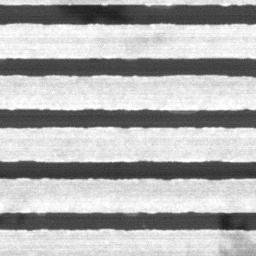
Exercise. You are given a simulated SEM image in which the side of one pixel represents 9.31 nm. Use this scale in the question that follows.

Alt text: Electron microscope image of lines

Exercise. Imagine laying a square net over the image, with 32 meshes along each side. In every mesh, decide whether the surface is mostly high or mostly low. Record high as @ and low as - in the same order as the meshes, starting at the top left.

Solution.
-------------@----@-@@-----@@@@@
--------------------------------
--------------------------------
@@@@@@@@@@@@@@@@@@@@@@@@@@@@@@@@
@@@@@@@@@@@@@@@@@@@@@@@@@@@@@@@@
@@@@@@@@@@@@@@@@@@@@@@@@@@@@@@@@
@@@@@@@@@@@@@@@@@@@@@@@@@@@@@@@@
--------------------------------
--------------------------------
--------------------------------
@@@@@@@@@@@@@@@@@@@@@@@@@@@@@@@@
@@@@@@@@@@@@@@@@@@@@@@@@@@@@@@@@
@@@@@@@@@@@@@@@@@@@@@@@@@@@@@@@@
@@@@@@@@@@@@@@@@@@@@@@@@@@@@@@@@
--------------------------------
--------------------------------
@@@@@@@@@@@@@@@@@@@@@@@@@@@@@@@@
@@@@@@@@@@@@@@@@@@@@@@@@@@@@@@@@
@@@@@@@@@@@@@@@@@@@@@@@@@@@@@@@@
@@@@@@@@@@@@@@@@@@@@@@@@@@@@@@@@
--------------------------------
--------------------------------
--@@-@@----@--------------------
@@@@@@@@@@@@@@@@@@@@@@@@@@@@@@@@
@@@@@@@@@@@@@@@@@@@@@@@@@@@@@@@@
@@@@@@@@@@@@@@@@@@@@@@@@@@@@@@@@
------------------@@------------
--------------------------------
--------------------------------
@@@@@@@@@@@@@@@@@@@@@@@@@@@@@@@@
@@@@@@@@@@@@@@@@@@@@@@@@@@@@@@@@
@@@@@@@@@@@@@@@@@@@@@@@@@@@@@@@@